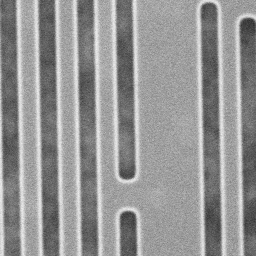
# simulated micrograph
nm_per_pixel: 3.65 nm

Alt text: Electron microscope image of groups of lines, slits or small figures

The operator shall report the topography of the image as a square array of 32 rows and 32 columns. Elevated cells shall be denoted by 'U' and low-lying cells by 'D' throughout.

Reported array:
DDUUUDDUUDDDUUDDDUUUUUUUUDDUUUUU
DDUUUDDUUDDDUUDDDUUUUUUUUDDUUUUU
DDUUUDDUUDDDUUDDDUUUUUUUUDDUUUDD
DDUUUDDUUDDDUUDDDUUUUUUUUDDUUUDD
DDUUUDDUUUDDUUDDDUUUUUUUUDDUUUDD
DDUUUDDUUUDDUUDDDUUUUUUUUDDUUUDD
DDUUUDDUUUDDUUDDDUUUUUUUUDDUUUDD
DDUUUDDUUUDDUUDDDUUUUUUUUDDUUUDD
DDUUUDDUUUDDUUDDDUUUUUUUUDDUUUDD
DDUUUDDUUUDDUUDDDUUUUUUUUDDUUUDD
DDUUUDDUUUDDUUDDDUUUUUUUUDDUUUDD
DDUUUDDUUUDDUUDDDUUUUUUUUDDUUUDD
DDUUUDDUUUDDUUDDDUUUUUUUUDDDUUDD
DDUUUDDUUUDDUUUDDUUUUUUUUDDDUUDD
DDUUUDDUUUDDUUUDDUUUUUUUUDDDUUDD
DDUUUDDUUUDDUUUDDUUUUUUUUDDDUUDD
DDUUUDDUUUDDUUUDDUUUUUUUUDDDUUDD
DDUUUDDUUUDDUUUDDUUUUUUUUDDDUUDD
DDDUUDDUUUDDUUUDDUUUUUUUUDDDUUDD
DDDUUDDUUUDDUUUDDUUUUUUUUDDDUUDD
DDDUUDDUUUDDUUUDDUUUUUUUUDDDUUDD
DDDUUDDUUUDDUUUDDUUUUUUUUDDDUUDD
DDDUUDDUUUDDUUUDUUUUUUUUUDDDUUDD
DDDUUDDUUUDDUUUUUUUUUUUUUDDDUUDD
DDDUUDDUUUDDUUUUUUUUUUUUUDDDUUDD
DDDUUDDUUUDDUUUUUUUUUUUUUDDDUUDD
DDDUUDDUUUDDUUUDDUUUUUUUUDDDUUDD
DDDUUDDDUUDDUUUDDUUUUUUUUDDDUUDD
DDDUUDDDUUDDUUUDDUUUUUUUUDDDUUDD
DDDUUDDDUUDDUUUDDUUUUUUUUDDDUUDD
DDDUUDDDUUDDUUUDDUUUUUUUUDDDUUDD
DDDUUDDDUUDDUUUDDUUUUUUUUDDDUUDD